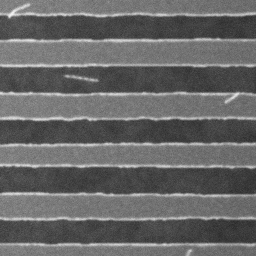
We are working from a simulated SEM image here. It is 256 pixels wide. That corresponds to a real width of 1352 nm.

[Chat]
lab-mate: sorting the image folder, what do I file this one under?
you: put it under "lines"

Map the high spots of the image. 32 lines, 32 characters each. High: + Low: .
++++++++++++++++++++++++++++++++
++++++++++++++++++++++++++++++++
................................
................................
................................
++++++++++++++++++++++++++++++++
++++++++++++++++++++++++++++++++
++++++++++++++++++++++++++++++++
................................
................................
................................
................................
++++++++++++++++++++++++++++++++
++++++++++++++++++++++++++++++++
++++++++++++++++++++++++++++++++
................................
................................
................................
++++++++++++++++++++++++++++++++
++++++++++++++++++++++++++++++++
++++++++++++++++++++++++++++++++
................................
................................
................................
++++++++++++++++++++++++++++++++
++++++++++++++++++++++++++++++++
++++++++++++++++++++++++++++++++
................................
................................
................................
................................
++++++++++++++++++++++++++++++++